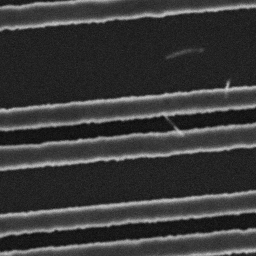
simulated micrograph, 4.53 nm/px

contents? lines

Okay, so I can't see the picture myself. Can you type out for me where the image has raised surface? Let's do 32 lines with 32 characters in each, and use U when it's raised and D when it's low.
DDDDUUUUUUUUUUUUUUUUUUUUUUUUUUUU
UUUUUUUUUUUUUUUUUUUUUUUUUDDDDDDD
UUUUUUUUUUUUUUDDDDDDDDDDDDDDDDDD
UUUUDDDDDDDDDDDDDDDDDDDDDDDDDDDD
DDDDDDDDDDDDDDDDDDDDDDDDDDDDDDDD
DDDDDDDDDDDDDDDDDDDDDDDDDDDDDDDD
DDDDDDDDDDDDDDDDDDDDDDDDDDDDDDDD
DDDDDDDDDDDDDDDDDDDDDDDDDDDDDDDD
DDDDDDDDDDDDDDDDDDDDDDDDDDDDDDDD
DDDDDDDDDDDDDDDDDDDDDDDDDDDDDDDD
DDDDDDDDDDDDDDDDDDDDDDDDDDDDDDDD
DDDDDDDDDDDDDDDDDDDDDDDDUUUUUUUU
DDDDDDDDDDDDUUUUUUUUUUUUUUUUUUUU
DDDUUUUUUUUUUUUUUUUUUUUUUUUUUUUU
UUUUUUUUUUUUUUUUUUUUDDDDDDDDDDDD
UUUUUUUUUUDDDDDDDDDDDDDDDDDDDDDD
DDDDDDDDDDDDDDDDDDDDDUUUUUUUUUUU
DDDDDDDDDDUUUUUUUUUUUUUUUUUUUUUU
UUUUUUUUUUUUUUUUUUUUUUUUUUUUUDDD
UUUUUUUUUUUUUUUUUUUUUDDDDDDDDDDD
UUUUUUUUUDDDDDDDDDDDDDDDDDDDDDDD
DDDDDDDDDDDDDDDDDDDDDDDDDDDDDDDD
DDDDDDDDDDDDDDDDDDDDDDDDDDDDDDDD
DDDDDDDDDDDDDDDDDDDDDDDDDDDDDDDD
DDDDDDDDDDDDDDDDDDDDDDDDDUUUUUUU
DDDDDDDDDDDDDDDUUUUUUUUUUUUUUUUU
DDDDUUUUUUUUUUUUUUUUUUUUUUUUUUUU
UUUUUUUUUUUUUUUUUUUUUUDDDDDDDDDD
UUUUUUUUUUUDDDDDDDDDDDDDDDDDDDDD
UDDDDDDDDDDDDDDDDDDDDDUUUUUUUUUU
DDDDDDDDDDDUUUUUUUUUUUUUUUUUUUUU
DUUUUUUUUUUUUUUUUUUUUUUUUUUUUUUU